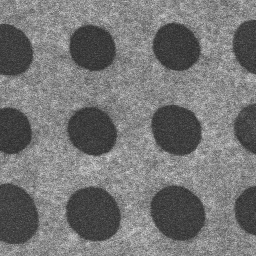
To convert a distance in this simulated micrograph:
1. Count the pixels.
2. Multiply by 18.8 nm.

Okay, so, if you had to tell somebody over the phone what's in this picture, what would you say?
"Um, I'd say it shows holes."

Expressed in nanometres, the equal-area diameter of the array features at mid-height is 939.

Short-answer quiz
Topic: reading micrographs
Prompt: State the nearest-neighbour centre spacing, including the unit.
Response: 1560 nm